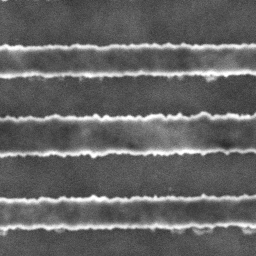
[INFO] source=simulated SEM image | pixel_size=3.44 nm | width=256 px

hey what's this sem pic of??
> lines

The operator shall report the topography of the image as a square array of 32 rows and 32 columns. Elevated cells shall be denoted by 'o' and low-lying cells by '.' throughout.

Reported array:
................................
................................
................................
................................
................................
................................
oooooooooooooooooooooooooooooooo
oooooooooooooooooooooooooooooooo
oooooooooooooooooooooooooooooooo
oooo.ooo.oooooo.................
................................
................................
................................
................................
...................o..o.oooooo.o
oooooooooooooooooooooooooooooooo
oooooooooooooooooooooooooooooooo
oooooooooooooooooooooooooooooooo
oooooooooooooooooooooooooooooooo
o...............................
................................
................................
................................
................................
..............................o.
oooooooooooooooooooooooooooooooo
oooooooooooooooooooooooooooooooo
oooooooooooooooooooooooooooooooo
oo.oooo.oooooo.......oo.........
................................
................................
................................